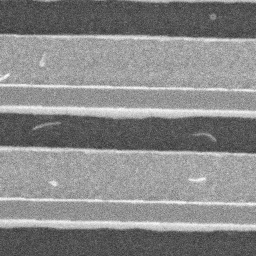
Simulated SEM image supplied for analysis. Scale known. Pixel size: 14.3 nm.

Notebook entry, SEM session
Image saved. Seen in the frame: lines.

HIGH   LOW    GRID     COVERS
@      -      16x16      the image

----------------
----------------
@@@@@@@@@@@@@@@-
@@@@@@@@@@@@@@@@
@@@@@@@@@@@@@@@@
@@@@@@@@@@@@@@@@
@@@@@@@@@@@@@@@@
----------------
----------------
@@@@@@@@@-------
@@@@@@@@@@@@@@@@
@@@@@@@@@@@@@@@@
@@@@@@@@@@@@@@@@
@@@@@@@@@@@@@@@@
----------------
----------------